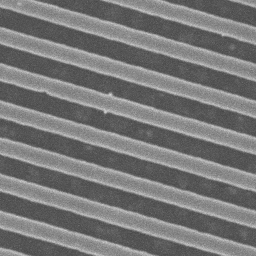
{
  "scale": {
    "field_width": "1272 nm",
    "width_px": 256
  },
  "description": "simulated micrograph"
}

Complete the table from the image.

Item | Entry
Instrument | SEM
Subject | parallel lines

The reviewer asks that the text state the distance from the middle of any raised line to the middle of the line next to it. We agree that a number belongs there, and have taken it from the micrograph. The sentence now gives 176 nanometres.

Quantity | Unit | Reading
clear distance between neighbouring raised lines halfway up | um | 0.0973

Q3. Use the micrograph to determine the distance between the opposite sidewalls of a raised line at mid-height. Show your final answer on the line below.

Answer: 78.8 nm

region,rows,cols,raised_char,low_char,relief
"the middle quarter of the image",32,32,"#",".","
....#############...............
.......##############...........
..........###############.......
..............##############....
.................##############.
###..................###########
#######.................########
##########.#...............#####
##############.................#
...##############...............
......###############...........
..........#############.........
.............##############.....
.................##############.
##.................#############
######..................########
#########..................#####
#############.................##
..##############................
.....###############............
.........##############.........
............###############.....
................#############...
##.................#############
#####.................##########
#########.................######
############..................##
.###############................
.....##############.............
........###############.........
............#############.......
...............##############...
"